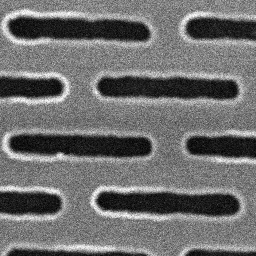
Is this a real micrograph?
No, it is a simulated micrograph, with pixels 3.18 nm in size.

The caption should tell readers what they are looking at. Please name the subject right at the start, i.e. holes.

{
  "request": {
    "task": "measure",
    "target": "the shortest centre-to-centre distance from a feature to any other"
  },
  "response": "333 nm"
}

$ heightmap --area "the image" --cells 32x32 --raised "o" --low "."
oooooooooooooooooooooooooooooooo
oooooooooooooooooooooooooooooooo
o..........o....oooooooo.......o
o..................oooo.........
oo.................ooooo........
oooooooooooooooooooooooooooooooo
oooooooooooooooooooooooooooooooo
oooooooooooooooooooooooooooooooo
oooooooooooooooooooooooooooooooo
.oooooooooooooo...oooooooooooooo
........oooo..................oo
........oooo..................oo
ooooooooooooooooooooooo.ooo.oooo
oooooooooooooooooooooooooooooooo
oooooooooooooooooooooooooooooooo
oooooooooooooooooooooooooooooooo
oooooooooooooooooooooooooooooooo
o..................oooo.........
o..................oooo.........
ooooooooo.........oooooooo......
oooooooooooooooooooooooooooooooo
oooooooooooooooooooooooooooooooo
oooooooooooooooooooooooooooooooo
oooooooooooooooooooooooooooooooo
.......ooooo.................ooo
........oooo..................oo
.......ooooooooo..............oo
oooooooooooooooooooooooooooooooo
oooooooooooooooooooooooooooooooo
oooooooooooooooooooooooooooooooo
oooooooooooooooooooooooooooooooo
o..............ooooooooo........